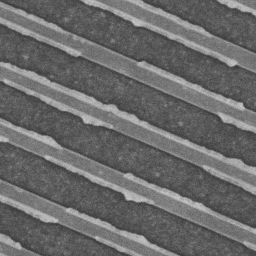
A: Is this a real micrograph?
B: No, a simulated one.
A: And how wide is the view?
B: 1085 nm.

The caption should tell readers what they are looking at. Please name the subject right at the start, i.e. parallel lines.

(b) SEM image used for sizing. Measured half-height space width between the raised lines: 0.144 micrometres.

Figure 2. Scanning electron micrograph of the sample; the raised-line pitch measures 229 nanometers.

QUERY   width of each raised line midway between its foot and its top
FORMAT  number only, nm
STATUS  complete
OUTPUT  83.3